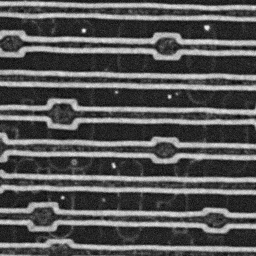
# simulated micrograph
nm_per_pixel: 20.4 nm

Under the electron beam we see wiring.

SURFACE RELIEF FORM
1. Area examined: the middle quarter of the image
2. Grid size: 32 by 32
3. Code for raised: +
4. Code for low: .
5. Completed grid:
................................
................................
................................
++++++++++++++++++++++++++++++++
++++++++++++++++++++++++++++++++
..............................++
................................
................................
................................
................................
+++.............................
++++++++++++++++++++++..........
++++++++++++++++++++++++++++++++
++++++++++++++++++++++++++++++++
+++.............................
+++.............................
................................
................................
................................
.......................+++++....
++++++++++++++++++++++++++++++++
++++++++++++++++++++++++++++++++
++++++++++++++++++++++++++++++++
.......................+++++....
................................
................................
................................
................................
+...............................
++++++++++++++++++++++++++++++++
++++++++++++++++++++++++++++++++
........................++++++++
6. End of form